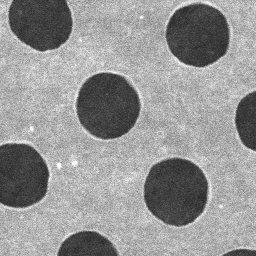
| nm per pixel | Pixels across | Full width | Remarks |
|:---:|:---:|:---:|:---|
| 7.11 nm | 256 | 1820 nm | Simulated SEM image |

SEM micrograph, holes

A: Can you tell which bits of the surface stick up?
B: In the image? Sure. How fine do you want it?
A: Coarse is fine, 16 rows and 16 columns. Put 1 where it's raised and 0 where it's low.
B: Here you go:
1000111111100111
1000011111000011
1000111111000011
1111111111100011
1111111111111111
1111100011111111
1111100001111110
1111100001111110
1111110011111110
0011111111111111
0001111110001111
0001111110000111
0001111110000111
1111111111001111
1111101111111111
1111000111111111